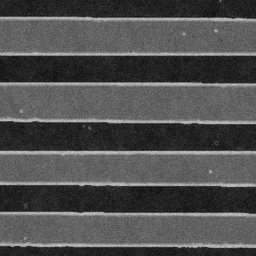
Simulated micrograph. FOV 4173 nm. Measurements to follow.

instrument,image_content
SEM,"lines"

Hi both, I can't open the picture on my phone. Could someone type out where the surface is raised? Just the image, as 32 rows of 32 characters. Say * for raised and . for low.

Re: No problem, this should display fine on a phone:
................................
................................
********************************
********************************
********************************
********************************
********************************
................................
................................
................................
************....................
********************************
********************************
********************************
********************************
................................
................................
................................
................................
********************************
********************************
********************************
********************************
................................
................................
................................
................................
********************************
********************************
********************************
********************************
................................